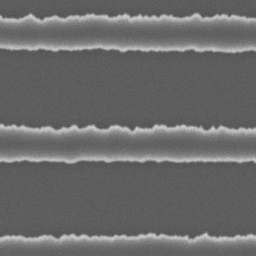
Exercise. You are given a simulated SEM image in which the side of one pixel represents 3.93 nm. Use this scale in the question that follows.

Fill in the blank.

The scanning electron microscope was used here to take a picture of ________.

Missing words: lines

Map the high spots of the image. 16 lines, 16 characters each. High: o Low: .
................
oooooooooooooooo
oooooooooooooooo
................
................
................
................
................
oooooooooooooooo
oooooooooooooooo
................
................
................
................
................
oooooooooooooooo